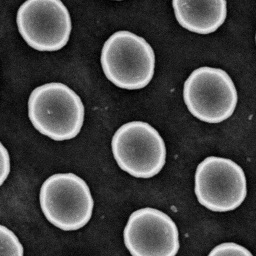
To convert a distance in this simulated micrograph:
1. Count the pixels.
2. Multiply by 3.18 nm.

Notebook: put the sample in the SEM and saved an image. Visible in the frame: raised bodies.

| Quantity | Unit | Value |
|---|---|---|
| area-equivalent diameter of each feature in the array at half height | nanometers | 163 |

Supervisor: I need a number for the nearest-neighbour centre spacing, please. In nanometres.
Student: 281